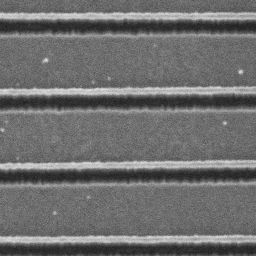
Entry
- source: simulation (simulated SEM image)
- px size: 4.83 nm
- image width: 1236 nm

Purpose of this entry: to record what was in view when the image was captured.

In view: lines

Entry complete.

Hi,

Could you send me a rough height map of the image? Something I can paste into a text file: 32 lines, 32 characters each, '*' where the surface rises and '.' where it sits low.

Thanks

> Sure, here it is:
********************************
********************************
................................
................................
********************************
********************************
********************************
********************************
********************************
********************************
********************************
********************************
................................
................................
********************************
********************************
********************************
********************************
********************************
********************************
********************************
................................
................................
********************************
********************************
********************************
********************************
********************************
********************************
********************************
................................
................................